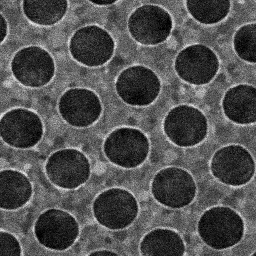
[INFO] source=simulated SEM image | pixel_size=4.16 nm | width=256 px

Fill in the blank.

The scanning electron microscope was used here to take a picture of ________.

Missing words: a regular array of holes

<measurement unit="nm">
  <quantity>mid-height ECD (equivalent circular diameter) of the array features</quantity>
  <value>181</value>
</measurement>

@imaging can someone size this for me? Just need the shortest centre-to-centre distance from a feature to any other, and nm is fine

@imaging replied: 257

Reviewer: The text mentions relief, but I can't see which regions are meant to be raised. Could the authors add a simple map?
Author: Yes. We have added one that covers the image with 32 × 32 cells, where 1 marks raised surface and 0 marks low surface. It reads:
11100000011100111111111000000111
11100000111111111000011100000111
01110000111111110000001100001111
01111111110001110000001111111100
01111111100000110000011111111000
11111111100000111100111111111000
11000011100000111111110000011000
10000001100000111111110000011100
10000001111111110001110000011111
11000001111111100000110000011111
11100011111111000000111100111101
11111111000011100000111111110000
11111110000011100001111111110000
11111110000001111111110001110000
00000111000001111111100000110000
00000111100011111111000000111101
00000111111111000011000000111111
00000111111110000001100001111111
11001111111110000001111111110001
11111100000110000001111111100000
11111100000111000011111111000000
00011100000111111111000011000000
00001100000111111110000011100001
00001111001111011110000001111111
00001111111100000110000011111111
00011111111100000111000011111111
11111000111100000111111111000011
11111000001100000111111110000011
11110000001110001111011110000001
00110000001111111100000110000011
00011000011111111000000111000011
00011111111100111100000111111111